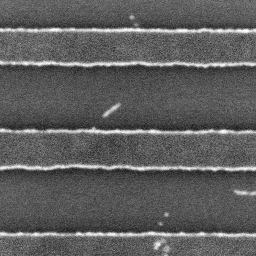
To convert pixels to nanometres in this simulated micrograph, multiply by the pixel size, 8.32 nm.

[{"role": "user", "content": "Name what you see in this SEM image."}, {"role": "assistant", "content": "lines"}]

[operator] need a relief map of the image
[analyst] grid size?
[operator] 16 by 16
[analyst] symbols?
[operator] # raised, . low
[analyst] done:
................
................
################
################
................
................
................
................
################
################
#.#.....########
................
................
................
................
################